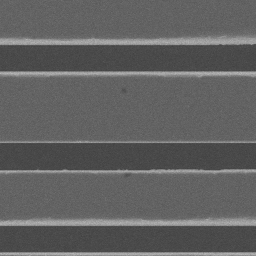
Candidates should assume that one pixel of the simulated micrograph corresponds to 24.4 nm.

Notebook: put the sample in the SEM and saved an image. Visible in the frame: lines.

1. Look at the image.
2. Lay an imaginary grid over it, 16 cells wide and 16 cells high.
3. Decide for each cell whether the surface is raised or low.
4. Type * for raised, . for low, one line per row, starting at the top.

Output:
****************
****************
****************
................
................
****************
****************
****************
****************
................
................
****************
****************
****************
................
................